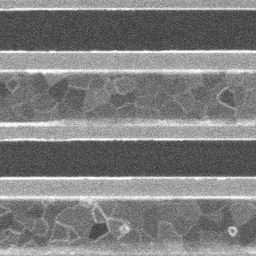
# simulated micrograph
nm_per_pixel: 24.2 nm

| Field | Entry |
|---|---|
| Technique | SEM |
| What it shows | lines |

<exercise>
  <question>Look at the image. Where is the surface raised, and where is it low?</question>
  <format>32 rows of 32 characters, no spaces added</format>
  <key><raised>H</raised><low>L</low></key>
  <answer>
LLLLLLLLLLLLLLLLLLLLLLLLLLLLLLLL
HHHHHHHHHHHHHHHHHHHHHHHHHHHHHHHH
HHHHHHHHHHHHHHHHHHHHHHHHHHHHHHHH
HHHHHHHHHHHHHHHHHHHHHHHHHHHHHHHH
HHHHHHHHHHHHHHHHHHHHHHHHHHHHHHHH
HHHHHHHHHHHHHHHHHHHHHHHHHHHHHHHH
LLLLLLLLLLLLLLLLLLLLLLLLLLLLLLLL
LLLLLLLLLLLLLLLLLLLLLLLLLLLLLLLL
LLLLLLLLLLLLLLLLLLLLLLLLLLLLLLLL
HHHHHHHHHHHHHHHHHHHHHHHHHHHHHHHH
HHHHHHHHHHHHHHHHHHHHHHHHHHHHHHHH
HHHHHHHHHHHHHHHHHHHHHHHHHHHHHHHH
HHHHHHHHHHHHHHHHHHHHHHHHHHHHHHHH
HHHHHHHHHHHHHHHHHHHHHHHHHHHHHHHH
HHHHHHHHHHHHHHHHHHHHHHHHHHHHHHHH
HHHHHLLLLLLLLLLLLLLLLLLLLLLLLLLL
LLLLLLLLLLLLLLLLLLLLLLLLLLLLLLLL
LHHHHHLLHHHHHHHHHHHHHHHHHHHHHHHH
HHHHHHHHHHHHHHHHHHHHHHHHHHHHHHHH
HHHHHHHHHHHHHHHHHHHHHHHHHHHHHHHH
HHHHHHHHHHHHHHHHHHHHHHHHHHHHHHHH
HHHHHHHHHHHHHHHHHHHHHHHHHHHHHHHH
LLLLLLLLLLLLLLLLLLLLLLLLLLLLLLLL
LLLLLLLLLLLLLLLLLLLLLLLLLLLLLLLL
LLLLLLLLLLLLLLLLLLLLLLLLLLLLLLLL
HHHHHHHHHHHHHHHHHHHHHHHHHHHHHHHH
HHHHHHHHHHHHHHHHHHHHHHHHHHHHHHHH
HHHHHHHHHHHHHHHHHHHHHHHHHHHHHHHH
HHHHHHHHHHHHHHHHHHHHHHHHHHHHHHHH
HHHHHHHHHHHHHHHHHHHHHHHHHHHHHHHH
HHHHHHHHHHHHHHHHHHHHHHHHHHHHHHHH
LLLLLLLLLLLLLLLLLLLLLLLLLLLLLLLL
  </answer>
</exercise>